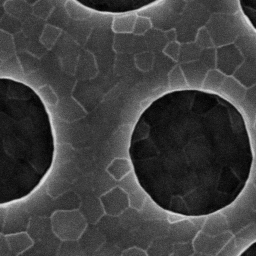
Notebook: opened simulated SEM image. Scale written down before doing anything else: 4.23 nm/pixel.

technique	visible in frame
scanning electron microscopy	holes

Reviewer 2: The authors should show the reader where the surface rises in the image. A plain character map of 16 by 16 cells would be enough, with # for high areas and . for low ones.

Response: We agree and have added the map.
######...######.
################
################
################
################
..##############
...######.....##
...######......#
...#####........
...#####........
...#####........
..#######......#
.#########.....#
################
################
###############.